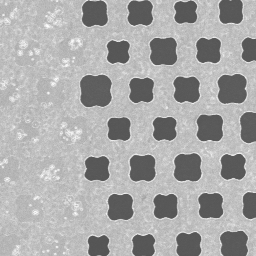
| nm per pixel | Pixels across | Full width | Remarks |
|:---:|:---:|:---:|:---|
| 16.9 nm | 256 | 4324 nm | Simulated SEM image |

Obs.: a regular array of holes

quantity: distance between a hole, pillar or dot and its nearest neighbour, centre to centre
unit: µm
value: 0.756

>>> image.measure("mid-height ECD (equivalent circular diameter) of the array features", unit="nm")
457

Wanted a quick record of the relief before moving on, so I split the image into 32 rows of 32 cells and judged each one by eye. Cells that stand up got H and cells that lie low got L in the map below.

HHHHHHHHHHHLLHHHLLLHHHLLHHHLLLHH
HHHHHHHHHHLLLHHHLLLHHHLLHHHLLLHH
HHHHHHHHHHLLLHHHLLLHHHLLLHHHLLHH
HHHHHHHHHHHHHHHHHHHHHHHHHHHHHHHH
HHHHHHHHHHHHHHHHHHHHHHHHHHHHHHHH
HHHHHHHHHHHHHHLLHHHLLLHHHLLLHHLL
HHHHHHHHHHHHHLLLHHHLLLHHHLLLHHLL
HHHHHHHHHHHHHHLLHHHLLLHHHLLHHHHL
HHHHHHHHHHHHHHHHHHHHHHHHHHHHHHHH
HHHHHHHHHHHLLHHHHHHHHHHHHHHHLLHH
HHHHHHHHHHLLLLHHLLLHHHLLLHHLLLLH
HHHHHHHHHHLLLLHHLLLHHHLLLHHLLLLH
HHHHHHHHHHLLLLHHLLLHHHLLLHHLLLLH
HHHHHHHHHHHHHHHHHHHHHHHHHHHHHHHH
HHHHHHHHHHHHHHHHHHHHHHHHHLLHHHLL
HHHHHHHHHHHHHLLLHHHLLLHHHLLLHHLL
HHHHHHHHHHHHHHLLHHHLLLHHHLLLHHLL
HHHHHHHHHHHHHHHLHHHHHHHHHLLHHHLL
HHHHHHHHHHHHHHHHHHHHHHHHHHHHHHHH
HHHHHHHHHHHHHHHHHLLHHHLLLHHHLLHH
HHHHHHHHHHHLLLHHLLLHHHLLLHHHLLLH
HHHHHHHHHHHLLLHHLLLHHHLLLHHHLLLH
HHHHHHHHHHHLLHHHHLLHHHLLLHHHHHHH
HHHHHHHHHHHHHHHHHHHHHHHHHHHHHHHH
HHHHHHHHHHHHHHLLHHHHLLHHHLLLHHHL
HHHHHHHHHHHHHHLLLHHLLLHHHLLLHHLL
HHHHHHHHHHHHHHLLLHHLLLHHHLLLHHLL
HHHHHHHHHHHHHHLLHHHHHHHHHHHHHHHH
HHHHHHHHHHHHHHHHHHHHHHHHHHHHHHHH
HHHHHHHHHHHLHHHHHLLHHHLLLHHHLLLH
HHHHHHHHHHHLLLHHHLLHHHLLLHHHLLLH
HHHHHHHHHHHLLLHHHLLHHHLLLHHHLLLH